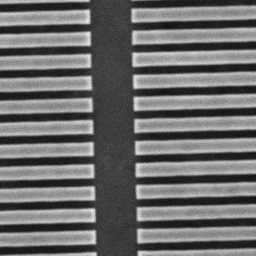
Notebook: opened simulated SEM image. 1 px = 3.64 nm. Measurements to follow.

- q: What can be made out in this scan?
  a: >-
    groups of lines, slits or small figures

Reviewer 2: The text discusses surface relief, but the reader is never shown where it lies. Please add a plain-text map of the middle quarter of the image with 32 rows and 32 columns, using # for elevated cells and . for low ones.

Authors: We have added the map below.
#######..........###............
................................
..............................##
#######..........###############
#######..........###############
#######..........###############
................................
................................
..................##############
#######...........##############
#######...........##############
#######...........##............
................................
...............................#
#######...........##############
#######...........##############
#######...........##############
................................
................................
..................##############
#######...........##############
#######...........##############
#######...........######........
................................
................................
#######...........##############
#######...........##############
#######...........##############
####............................
................................
..................##############
#######...........##############